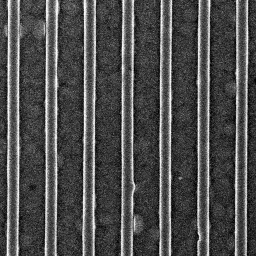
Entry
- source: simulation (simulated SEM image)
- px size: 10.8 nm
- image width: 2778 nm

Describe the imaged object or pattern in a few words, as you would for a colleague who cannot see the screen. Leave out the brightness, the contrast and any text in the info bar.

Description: parallel lines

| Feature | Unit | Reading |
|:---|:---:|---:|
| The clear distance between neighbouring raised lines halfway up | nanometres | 296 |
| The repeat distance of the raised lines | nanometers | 413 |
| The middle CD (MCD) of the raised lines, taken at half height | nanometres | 117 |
